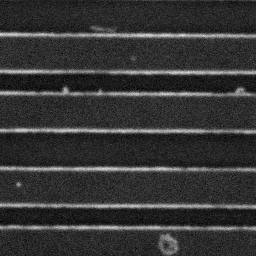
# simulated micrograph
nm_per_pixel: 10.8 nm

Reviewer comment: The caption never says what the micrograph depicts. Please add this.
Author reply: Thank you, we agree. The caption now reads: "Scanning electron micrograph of lines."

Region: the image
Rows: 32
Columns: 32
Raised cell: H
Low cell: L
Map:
LLLLLLLLLLLLLLLLLLLLLLLLLLLLLLLL
LLLLLLLLLLLLLLLLLLLLLLLLLLLLLLLL
LLLLLLLLLLLLLLLLLLLLLLLLLLLLLLLL
LLLLLLLLLLLLLLLLLLLLLLLLLLLLLLLL
HHHHHHHHHHHHHHHHHHHHHHHHHHHHHHHH
HHHHHHHHHHHHHHHHHHHHHHHHHHHHHHHH
HHHHHHHHHHHHHHHHHHHHHHHHHHHHHHHH
HHHHHHHHHHHHHHHHHHHHHHHHHHHHHHHH
HHHHHHHHHHHHHHHHHHHHHHHHHHHHHHHH
LLLLLLLLLLLLLLLLLLLLLLLLLLLLLLLL
LLLLLLLLLLLLLLLLLLLLLLLLLLLLLLLL
LLLLLLLLLLLLLLLLLLLLLLLLLLLLLLLL
HHHHHHHHHHHHHHHHHHHHHHHHHHHHHHHH
HHHHHHHHHHHHHHHHHHHHHHHHHHHHHHHH
HHHHHHHHHHHHHHHHHHHHHHHHHHHHHHHH
HHHHHHHHHHHHHHHHHHHHHHHHHHHHHHHH
LLLLLLLLLLLLLLLLLLLLLLLLLLLLLLLL
LLLLLLLLLLLLLLLLLLLLLLLLLLLLLLLL
LLLLLLLLLLLLLLLLLLLLLLLLLLLLLLLL
LLLLLLLLLLLLLLLLLLLLLLLLLLLLLLLL
LLLLLLLLLLLLLLLLLLLLLLLLLLLLLLLL
HHHHHHHHHHHHHHHHHHHHHHHHHHHHHHHH
HHHHHHHHHHHHHHHHHHHHHHHHHHHHHHHH
HHHHHHHHHHHHHHHHHHHHHHHHHHHHHHHH
HHHHHHHHHHHHHHHHHHHHHHHHHHHHHHHH
HHHHHHHHHHHHHHHHHHHHHHHHHHHHHHHH
LLLLLLLLLLLLLLLLLLLLLLLLLLLLLLLL
LLLLLLLLLLLLLLLLLLLLLLLLLLLLLLLL
HHHHHHHHHHHHHHHLLLLHLLLLLLLLLLLL
HHHHHHHHHHHHHHHHHHHHHHHHHHHHHHHH
HHHHHHHHHHHHHHHHHHHHHHHHHHHHHHHH
HHHHHHHHHHHHHHHHHHHHHHHHHHHHHHHH